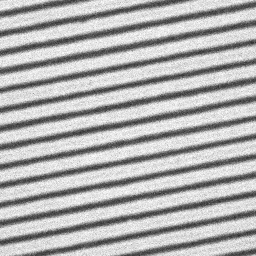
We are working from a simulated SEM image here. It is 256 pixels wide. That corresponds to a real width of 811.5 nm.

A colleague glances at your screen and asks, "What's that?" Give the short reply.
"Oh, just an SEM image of parallel lines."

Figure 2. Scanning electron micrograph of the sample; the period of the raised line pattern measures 59.1 nm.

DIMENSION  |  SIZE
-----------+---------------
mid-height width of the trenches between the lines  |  22.1 nm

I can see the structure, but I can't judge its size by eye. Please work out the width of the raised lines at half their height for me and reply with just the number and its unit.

35.8 nm